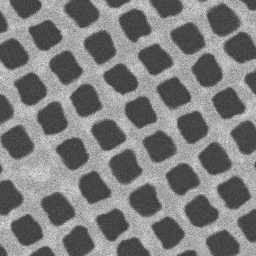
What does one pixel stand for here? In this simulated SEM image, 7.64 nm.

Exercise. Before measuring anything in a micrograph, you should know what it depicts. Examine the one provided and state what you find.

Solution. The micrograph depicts a regular array of holes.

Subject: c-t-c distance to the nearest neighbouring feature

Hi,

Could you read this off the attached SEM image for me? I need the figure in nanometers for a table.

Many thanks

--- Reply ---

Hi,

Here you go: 291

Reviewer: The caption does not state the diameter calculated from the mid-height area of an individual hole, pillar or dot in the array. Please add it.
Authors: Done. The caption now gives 0.231 um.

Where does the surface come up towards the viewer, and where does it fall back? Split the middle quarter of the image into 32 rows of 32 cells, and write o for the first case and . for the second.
....ooooooooo..ooooo.......ooooo
.....oooooo.....ooooo....ooooooo
....oooooo.......oooo..ooooooooo
...ooooooo........ooooooooo.oooo
..oooooooo.........oooooo....ooo
oooo...ooooo......ooooo.......oo
ooo.....ooooo.....ooooo........o
oo......oooooo.ooooooooo........
o........oooooooooo..ooo........
oo.......ooooooo......ooo......o
oo.......oooooo.......oooo...ooo
ooo......oooooo........ooooooooo
ooo....oooooooo........ooooooo..
oooooooooooooooo.......oooooo...
.oooooooo....oooo......ooooo....
.oooooo......ooooo..oooooooo....
ooooooo.......oooooooooo.oooo...
ooooooo........ooooooo....ooo...
oo.ooooo........oooo.......ooo..
.....oooo......ooooo.......oooo.
.....oooo....ooooooo........oooo
......oooo..ooo.ooooo.......oooo
......oooooooo...oooo.......oooo
......oooooo......ooo.....oooooo
......ooooo.......ooooo.oooooooo
o...ooooooo........ooooooooo...o
oo.ooooooooo........ooooooo.....
oooooo...ooo.......oooooo.......
oooo.....oooo....ooooooooo......
oooo......oooo..oooooooooo......
oooo.......ooooooooo..ooooo.....
oooo........oooooo.....oooo....o